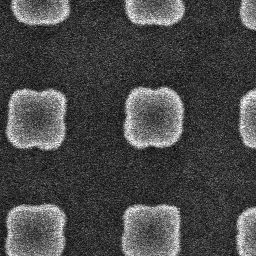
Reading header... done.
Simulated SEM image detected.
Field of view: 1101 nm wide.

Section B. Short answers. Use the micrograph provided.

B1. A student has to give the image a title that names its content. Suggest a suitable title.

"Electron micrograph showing raised bodies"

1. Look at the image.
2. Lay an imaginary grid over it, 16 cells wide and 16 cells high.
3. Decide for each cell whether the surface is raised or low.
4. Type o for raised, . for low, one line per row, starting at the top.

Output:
.ooo....ooo....o
..o.......o....o
................
................
................
................
.ooo....ooo....o
.ooo....ooo....o
.ooo....ooo....o
................
................
................
................
.ooo....ooo....o
oooo....ooo....o
oooo....ooo....o